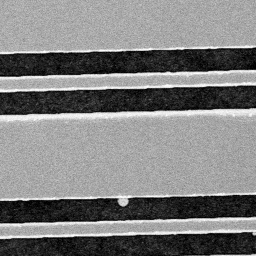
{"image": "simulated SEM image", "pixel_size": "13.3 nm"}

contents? lines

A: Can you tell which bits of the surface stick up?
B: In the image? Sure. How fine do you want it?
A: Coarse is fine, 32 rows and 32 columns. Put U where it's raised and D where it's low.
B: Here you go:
UUUUUUUUUUUUUUUUUUUUUUUUUUUUUUUU
UUUUUUUUUUUUUUUUUUUUUUUUUUUUUUUU
UUUUUUUUUUUUUUUUUUUUUUUUUUUUUUUU
UUUUUUUUUUUUUUUUUUUUUUUUUUUUUUUU
UUUUUUUUUUUUUUUUUUUUUUUUUUUUUUUU
UUUUUUUUUUUUUUUUUUUUUUUUUUUUUUUU
UUUUUUDDDDDDDDDDDDDDDDDDDDDDDDDD
DDDDDDDDDDDDDDDDDDDDDDDDDDDDDDDD
DDDDDDDDDDDDDDDDDDDDDDDDDDDDDDDD
DDDDDDUUUUUUUUUUUUUUUUUUUUUUUUUU
UUUUUUUUUUUUUUUUUUUUUUUUUUUUUUUU
DDDDDDDDDDDDDDDDDDDDDDDDDDDDDDDD
DDDDDDDDDDDDDDDDDDDDDDDDDDDDDDDD
DDDDDDDDDDDDDDDDDDDDDDDDDDDDDDDD
DDDUUUUUUUUUUUUUUUUUUUUUUUUUUUUU
UUUUUUUUUUUUUUUUUUUUUUUUUUUUUUUU
UUUUUUUUUUUUUUUUUUUUUUUUUUUUUUUU
UUUUUUUUUUUUUUUUUUUUUUUUUUUUUUUU
UUUUUUUUUUUUUUUUUUUUUUUUUUUUUUUU
UUUUUUUUUUUUUUUUUUUUUUUUUUUUUUUU
UUUUUUUUUUUUUUUUUUUUUUUUUUUUUUUU
UUUUUUUUUUUUUUUUUUUUUUUUUUUUUUUU
UUUUUUUUUUUUUUUUUUUUUUUUUUUUUUUU
UUUUUUUUUUUUUUUUUUUUUUUUUUUUUUUU
UUUUUUUUUUUUUUUUUUUUUDDDDDDDDDDD
DDDDDDDDDDDDDDDDDDDDDDDDDDDDDDDD
DDDDDDDDDDDDDDDDDDDDDDDDDDDDDDDD
DDDDDDDDDDDDDDDDDDDDUUUUUUUUUUUU
UUUUUUUUUUUUUUUUUUUUUUUUUUUUUUUU
UUUUUUUUDDDDDDDDDDDDDDDDDDDDDDDD
DDDDDDDDDDDDDDDDDDDDDDDDDDDDDDDD
DDDDDDDDDDDDDDDDDDDDDDDDDDDDDDDD